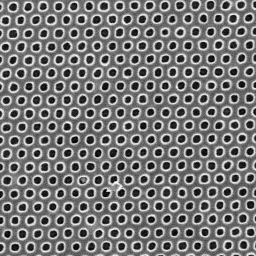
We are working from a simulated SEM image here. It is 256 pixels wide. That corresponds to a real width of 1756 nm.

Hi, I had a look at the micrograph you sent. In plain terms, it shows a regular array of holes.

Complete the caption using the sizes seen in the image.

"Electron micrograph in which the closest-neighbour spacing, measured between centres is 0.102 um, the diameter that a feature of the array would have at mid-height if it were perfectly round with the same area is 55.2 nanometres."